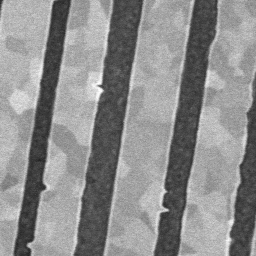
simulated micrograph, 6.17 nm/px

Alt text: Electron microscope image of one or a few lines or trenches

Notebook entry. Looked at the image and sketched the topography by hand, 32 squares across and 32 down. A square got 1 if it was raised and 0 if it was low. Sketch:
11111110011111000011111100011111
11111100011111000011111100011111
11111100011111000011111100011111
11111100111111000111111000011111
11111100111110000111111000011111
11111100111110000111111000011111
11111100111110000111111000111111
11111000111110000111111000111111
11111000111110000111111000111111
11111001111110000111111000111111
11111001111100001111110000111110
11111001111100001111110000111110
11110001111100001111110000111111
11110001111100001111110001111110
11110001111100001111110001111110
11110011111100001111110001111110
11110011111100011111100001111110
11110011111000011111100001111110
11110011111000011111100011111110
11100011111000011111100011111100
11100011111000011111100011111100
11100011111000011111100011111100
11100111111000111111100011111100
11100011110000111111100111111100
11100111110000111111000111111000
11100111110000111111000111111000
11000111110000111111000111111000
11000111110000111111000111111000
11000111110000111111000111111000
11001111110001111111000111111000
11001111100001111110000111111000
11001111100001111110001111111000